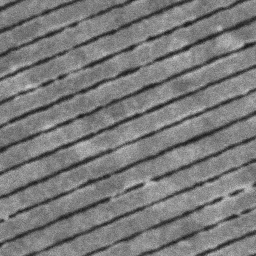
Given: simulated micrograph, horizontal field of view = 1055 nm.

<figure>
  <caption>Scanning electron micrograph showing parallel lines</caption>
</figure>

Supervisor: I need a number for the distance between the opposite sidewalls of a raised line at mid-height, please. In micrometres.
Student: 0.0717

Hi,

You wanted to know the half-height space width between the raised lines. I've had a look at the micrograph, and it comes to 4.61 pixels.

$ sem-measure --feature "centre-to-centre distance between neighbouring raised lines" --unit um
0.0898